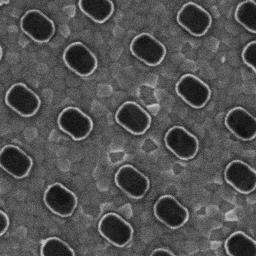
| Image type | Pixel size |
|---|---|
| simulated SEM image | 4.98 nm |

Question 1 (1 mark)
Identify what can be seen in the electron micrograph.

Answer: a regular array of raised bodies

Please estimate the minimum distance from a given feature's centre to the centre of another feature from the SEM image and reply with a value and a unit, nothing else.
0.269 micrometres